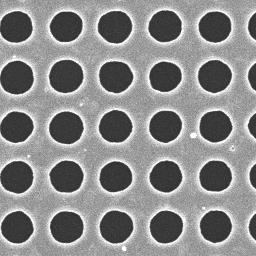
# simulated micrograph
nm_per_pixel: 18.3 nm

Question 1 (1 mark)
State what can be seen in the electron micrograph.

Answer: a regular array of holes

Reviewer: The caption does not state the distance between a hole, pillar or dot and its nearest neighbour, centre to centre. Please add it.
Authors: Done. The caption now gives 903 nanometers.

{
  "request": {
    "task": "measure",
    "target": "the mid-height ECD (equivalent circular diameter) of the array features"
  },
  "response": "608 nm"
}